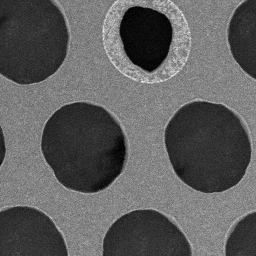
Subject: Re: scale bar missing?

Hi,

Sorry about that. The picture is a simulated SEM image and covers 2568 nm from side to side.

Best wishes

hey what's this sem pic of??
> holes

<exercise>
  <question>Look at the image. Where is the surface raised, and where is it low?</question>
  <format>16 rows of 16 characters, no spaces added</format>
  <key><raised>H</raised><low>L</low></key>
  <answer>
LLLLHHHHLHHHHHHL
LLLLHHHHLLLHHHLL
LLLLHHHHLLLHHHLL
LLLLHHHHLLHHHHHL
LLLHHHHHHHHHHHHL
HHHHHHHHHHHHHHHH
HHHHLLHHHHHHLLHH
HHHLLLLHHHHLLLLH
HHHLLLLLHHLLLLLL
HHHLLLLLHHLLLLLL
HHHLLLLLHHHLLLLH
HHHHLLLHHHHHLLLH
HHHHHHHHHHHHHHHH
LLLHHHHHLLHHHHHL
LLLLHHHLLLLHHHLL
LLLLHHLLLLLLHHLL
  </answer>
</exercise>